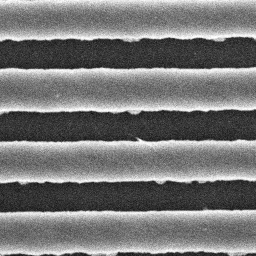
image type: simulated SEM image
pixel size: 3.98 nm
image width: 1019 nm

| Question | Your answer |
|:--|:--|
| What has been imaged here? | lines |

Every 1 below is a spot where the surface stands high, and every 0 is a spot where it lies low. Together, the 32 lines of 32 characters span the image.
11111111111111111111111111111111
11111111111111111111111111111111
11111111111111111111111111111111
11111111111111111111111111111111
11111111111111111111111111111111
00000000000000000000000000000000
00000000000000000000000000000000
00000000000000000000000000000000
00000000000000000000000000000001
11111111111111111111111111111111
11111111111111111111111111111111
11111111111111111111111111111111
11111111111111111111111111111111
11111111111111111111111111111111
00000000000000000000000000000000
00000000000000000000000000000000
00000000000000000000000000000000
00000000000000000000000000000000
11111111111111111111111111111111
11111111111111111111111111111111
11111111111111111111111111111111
11111111111111111111111111111111
11111111111111111110111111100001
00000000000000000000000000000000
00000000000000000000000000000000
00000000000000000000000000000000
00000000011111100011111111111111
11111111111111111111111111111111
11111111111111111111111111111111
11111111111111111111111111111111
11111111111111111111111111111111
11111111111111100011100000111111